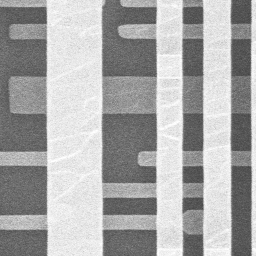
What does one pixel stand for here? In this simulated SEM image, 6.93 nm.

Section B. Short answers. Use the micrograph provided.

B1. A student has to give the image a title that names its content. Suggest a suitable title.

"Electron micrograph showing wiring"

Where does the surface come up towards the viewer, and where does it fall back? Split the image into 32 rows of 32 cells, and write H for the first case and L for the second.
LLLLLLHHHHHHHLLLLLLLHHHLLLHHHLLL
LLLLLLHHHHHHHLLLLLLLHHHLLLHHHLLL
LLLLLLHHHHHHHLLLLLLLHHHLLLHHHLLL
LLLLLLHHHHHHHLLLLLLLHHHLLLHHHLLL
LLLLLLHHHHHHHLLLLLLLHHHLLLHHHLLL
LLLLLLHHHHHHHLLLLLLLHHHLLLHHHLLL
LLLLLLHHHHHHHLLLLLLLHHHLLLHHHLLL
LLLLLLHHHHHHHLLLLLLLHHHLLLHHHLLL
LLLLLLHHHHHHHLLLLLLLHHHLLLHHHLLL
LLLLLLHHHHHHHLLLLLLLHHHLLLHHHLLL
LLLLLLHHHHHHHLLLLLLLHHHLLLHHHLLL
LLLLLLHHHHHHHLLLLLLLHHHLLLHHHLLL
LLLLLLHHHHHHHLLLLLLLHHHLLLHHHLLL
LLLLLLHHHHHHHLLLLLLLHHHLLLHHHLLL
LLLLLLHHHHHHHLLLLLLLHHHLLLHHHLLL
LLLLLLHHHHHHHLLLLLLLHHHLLLHHHLLL
LLLLLLHHHHHHHLLLLLLLHHHLLLHHHLLL
LLLLLLHHHHHHHLLLLLLLHHHLLLHHHLLL
LLLLLLHHHHHHHLLLLLLLHHHLLLHHHLLL
LLLLLLHHHHHHHLLLLLLLHHHLLLHHHLLL
LLLLLLHHHHHHHLLLLLLLHHHLLLHHHLLL
LLLLLLHHHHHHHLLLLLLLHHHLLLHHHLLL
LLLLLLHHHHHHHLLLLLLLHHHLLLHHHLLL
LLLLLLHHHHHHHLLLLLLLHHHLLLHHHLLL
LLLLLLHHHHHHHLLLLLLLHHHLLLHHHLLL
LLLLLLHHHHHHHLLLLLLLHHHLLLHHHLLL
LLLLLLHHHHHHHLLLLLLLHHHLLLHHHLLL
LLLLLLHHHHHHHLLLLLLLHHHLLLHHHLLL
LLLLLLHHHHHHHLLLLLLLHHHLLLHHHLLL
LLLLLLHHHHHHHLLLLLLLHHHLLLHHHLLL
LLLLLLHHHHHHHLLLLLLLHHHLLLHHHLLL
LLLLLLHHHHHHHLLLLLLLHHHLLLHHHLLL